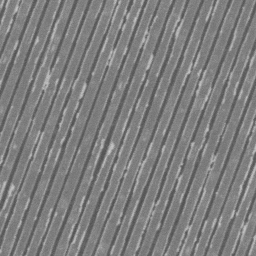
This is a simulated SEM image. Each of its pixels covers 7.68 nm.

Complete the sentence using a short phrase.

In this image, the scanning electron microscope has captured parallel lines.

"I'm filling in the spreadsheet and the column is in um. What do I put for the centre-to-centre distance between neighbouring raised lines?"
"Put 0.1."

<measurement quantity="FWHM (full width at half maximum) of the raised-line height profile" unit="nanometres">74.7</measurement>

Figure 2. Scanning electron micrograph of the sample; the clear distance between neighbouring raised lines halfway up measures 29.7 nm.